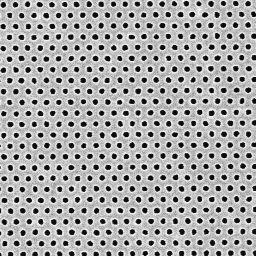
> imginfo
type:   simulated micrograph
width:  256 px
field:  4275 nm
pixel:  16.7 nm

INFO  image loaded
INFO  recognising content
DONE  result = a regular array of holes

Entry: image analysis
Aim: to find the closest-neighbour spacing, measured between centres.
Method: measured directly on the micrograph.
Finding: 200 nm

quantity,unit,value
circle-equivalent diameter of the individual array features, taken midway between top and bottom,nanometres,97.9